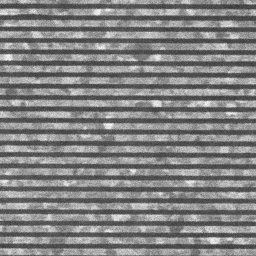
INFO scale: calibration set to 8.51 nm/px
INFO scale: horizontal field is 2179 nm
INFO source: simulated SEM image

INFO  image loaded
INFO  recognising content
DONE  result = parallel lines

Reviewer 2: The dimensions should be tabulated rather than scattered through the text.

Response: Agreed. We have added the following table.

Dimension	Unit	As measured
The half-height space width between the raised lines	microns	0.0489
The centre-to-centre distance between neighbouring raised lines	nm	97.3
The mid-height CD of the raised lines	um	0.0489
